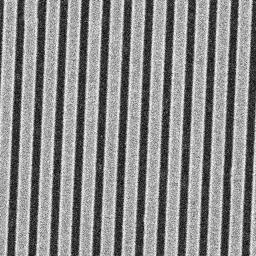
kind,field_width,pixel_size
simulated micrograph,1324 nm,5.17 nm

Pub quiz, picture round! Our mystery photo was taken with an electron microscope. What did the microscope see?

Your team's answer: parallel lines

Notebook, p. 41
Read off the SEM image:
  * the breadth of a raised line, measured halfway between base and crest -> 62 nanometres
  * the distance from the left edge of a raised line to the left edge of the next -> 110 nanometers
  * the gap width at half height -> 0.0471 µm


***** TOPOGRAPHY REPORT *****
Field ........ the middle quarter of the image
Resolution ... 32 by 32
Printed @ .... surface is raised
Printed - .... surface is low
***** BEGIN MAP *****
-@@@--@@@--@@@---@@---@@@--@@@--
-@@---@@@--@@@---@@---@@@--@@@--
@@@---@@@--@@@---@@---@@@--@@@--
@@@---@@@--@@@--@@@---@@@--@@@--
@@@---@@@--@@@--@@@---@@@--@@@--
@@@---@@@--@@@--@@@---@@---@@@--
@@@---@@@--@@@--@@@---@@---@@@--
@@@---@@@--@@@--@@@---@@---@@@--
@@@---@@---@@@--@@@---@@---@@@--
@@@---@@---@@@--@@@---@@---@@@--
@@@---@@---@@@--@@@--@@@---@@@--
@@@---@@---@@@--@@@--@@@---@@@--
@@@---@@---@@@--@@@--@@@---@@@--
@@@---@@---@@@--@@@--@@@---@@@--
@@@--@@@---@@@--@@@--@@@---@@@--
@@@--@@@---@@---@@@--@@@---@@@--
@@@--@@@---@@---@@@--@@@---@@@--
@@@--@@@---@@---@@@--@@@--@@@---
@@@--@@@---@@---@@@--@@@--@@@---
@@@--@@@---@@---@@@--@@@--@@@---
@@---@@@---@@---@@@--@@@--@@@---
@@---@@@--@@@---@@@--@@@--@@@---
@@---@@@--@@@---@@---@@@--@@@---
@@---@@@--@@@---@@---@@@--@@@---
@@---@@@--@@@---@@---@@@--@@@---
@@---@@@--@@@---@@---@@@--@@@---
@@---@@@--@@@---@@---@@@--@@@---
@@---@@@--@@@--@@@---@@@--@@@---
@@---@@@--@@@--@@@---@@---@@@---
@@---@@@--@@@--@@@---@@---@@@--@
@@---@@@--@@@--@@@---@@---@@@--@
@@---@@@--@@@--@@@---@@---@@@--@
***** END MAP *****